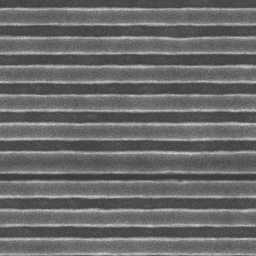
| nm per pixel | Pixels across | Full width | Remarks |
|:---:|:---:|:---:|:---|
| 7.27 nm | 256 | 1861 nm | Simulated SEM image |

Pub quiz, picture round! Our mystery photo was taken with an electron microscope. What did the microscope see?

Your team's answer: parallel lines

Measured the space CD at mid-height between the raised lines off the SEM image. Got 0.0918 microns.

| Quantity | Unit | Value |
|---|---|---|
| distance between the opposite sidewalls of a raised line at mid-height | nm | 118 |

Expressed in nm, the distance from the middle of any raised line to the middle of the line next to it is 209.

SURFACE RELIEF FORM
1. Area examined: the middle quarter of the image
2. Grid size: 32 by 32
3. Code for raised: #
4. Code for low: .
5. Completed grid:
................................
################################
################################
################################
###########......##.#.####......
................................
................................
................................
################################
################################
################################
################################
................................
................................
................................
################################
################################
################################
################################
................................
................................
................................
################################
################################
################################
################################
################################
................................
................................
################################
################################
################################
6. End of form